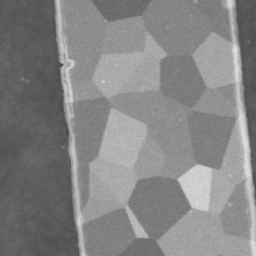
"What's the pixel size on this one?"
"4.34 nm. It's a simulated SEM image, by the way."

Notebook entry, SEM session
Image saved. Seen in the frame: one or a few lines or trenches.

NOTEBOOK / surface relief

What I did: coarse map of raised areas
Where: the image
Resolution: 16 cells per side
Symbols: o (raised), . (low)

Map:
....oooooooooo..
....oooooooooo..
....ooooooooooo.
....ooooooooooo.
....ooooooooooo.
....ooooooooooo.
....ooooooooooo.
....ooooooooooo.
.....oooooooooo.
.....oooooooooo.
.....oooooooooo.
.....ooooooooooo
.....ooooooooooo
.....ooooooooooo
.....ooooooooooo
.....ooooooooooo